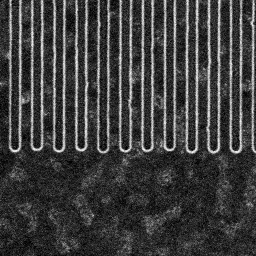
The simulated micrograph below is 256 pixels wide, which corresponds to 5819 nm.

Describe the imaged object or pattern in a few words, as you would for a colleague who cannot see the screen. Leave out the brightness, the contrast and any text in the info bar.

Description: parallel lines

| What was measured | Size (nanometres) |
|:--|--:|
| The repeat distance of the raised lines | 502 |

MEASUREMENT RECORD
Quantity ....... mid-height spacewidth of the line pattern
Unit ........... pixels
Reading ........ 8.75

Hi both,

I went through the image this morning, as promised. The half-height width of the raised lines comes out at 0.287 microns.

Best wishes